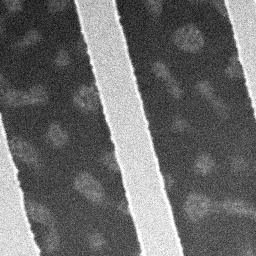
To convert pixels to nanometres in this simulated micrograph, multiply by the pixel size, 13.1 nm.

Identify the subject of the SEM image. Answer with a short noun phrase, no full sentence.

one or a few lines or trenches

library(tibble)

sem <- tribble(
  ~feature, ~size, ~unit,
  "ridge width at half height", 480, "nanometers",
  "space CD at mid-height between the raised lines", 1.37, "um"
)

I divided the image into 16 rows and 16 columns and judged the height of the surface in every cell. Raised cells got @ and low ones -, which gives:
-----@@-------@@
-----@@--------@
-----@@@-------@
------@@-------@
------@@-------@
------@@@-------
------@@@-------
-------@@-------
-------@@-------
@------@@@------
@-------@@------
@-------@@------
@-------@@------
@@------@@@-----
@@-------@@-----
@@-------@@-----